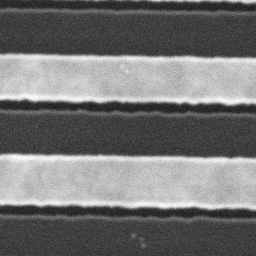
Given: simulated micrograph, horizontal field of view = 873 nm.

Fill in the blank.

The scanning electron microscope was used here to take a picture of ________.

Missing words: lines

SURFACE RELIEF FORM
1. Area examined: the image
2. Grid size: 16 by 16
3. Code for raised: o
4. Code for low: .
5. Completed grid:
................
................
................
oooo............
oooooooooooooooo
oooooooooooooooo
..............o.
................
................
................
oooooooooooooooo
oooooooooooooooo
oooooooooooooooo
................
................
................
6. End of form